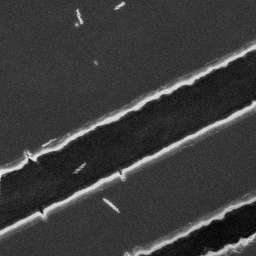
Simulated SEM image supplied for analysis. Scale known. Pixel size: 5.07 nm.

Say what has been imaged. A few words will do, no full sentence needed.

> one or a few lines or trenches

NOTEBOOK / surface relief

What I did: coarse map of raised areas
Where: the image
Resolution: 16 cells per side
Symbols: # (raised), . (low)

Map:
################
################
################
###############.
#############...
###########.....
#########.......
#######.......##
#####.......####
###.......######
#.......########
......##########
....############
..############..
############....
##########....##